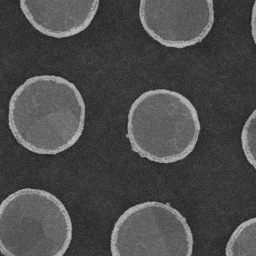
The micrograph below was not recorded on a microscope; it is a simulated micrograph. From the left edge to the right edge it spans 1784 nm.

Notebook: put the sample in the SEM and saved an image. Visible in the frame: raised bodies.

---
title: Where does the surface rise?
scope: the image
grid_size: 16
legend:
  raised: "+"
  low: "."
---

.+++++...++++...
..+++....++++...
..........++....
................
................
.++++...........
.++++....+++....
.++++...++++....
.++++...++++...+
..++.....+++...+
................
................
+++.............
++++....+++.....
++++...+++++...+
++++...+++++..++